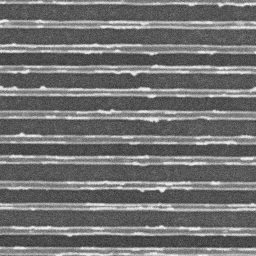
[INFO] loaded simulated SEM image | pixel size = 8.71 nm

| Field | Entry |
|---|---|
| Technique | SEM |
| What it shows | parallel lines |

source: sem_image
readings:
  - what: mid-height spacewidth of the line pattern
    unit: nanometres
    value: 138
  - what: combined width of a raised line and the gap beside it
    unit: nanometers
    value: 198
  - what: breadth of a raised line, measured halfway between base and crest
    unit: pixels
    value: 6.99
